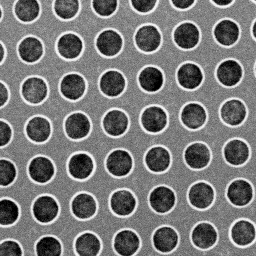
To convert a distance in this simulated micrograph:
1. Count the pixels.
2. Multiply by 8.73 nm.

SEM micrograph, a regular array of holes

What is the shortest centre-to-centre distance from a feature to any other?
340 nm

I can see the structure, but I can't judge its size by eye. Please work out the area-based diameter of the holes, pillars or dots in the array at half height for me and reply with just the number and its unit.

234 nanometres